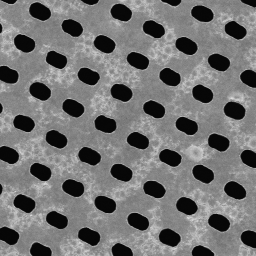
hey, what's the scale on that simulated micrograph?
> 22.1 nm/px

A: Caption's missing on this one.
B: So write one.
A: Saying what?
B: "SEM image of a regular array of holes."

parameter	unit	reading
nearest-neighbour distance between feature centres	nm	784